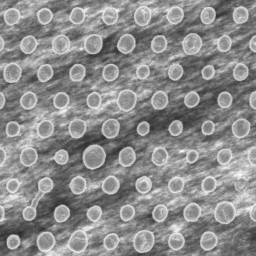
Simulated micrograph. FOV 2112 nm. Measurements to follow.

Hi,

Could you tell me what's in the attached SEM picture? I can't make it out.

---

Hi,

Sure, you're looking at a regular array of raised bodies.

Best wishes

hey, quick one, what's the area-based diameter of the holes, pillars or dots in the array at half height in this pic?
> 130 nm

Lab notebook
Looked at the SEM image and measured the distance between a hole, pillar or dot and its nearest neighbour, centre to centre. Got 32.2 pixels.